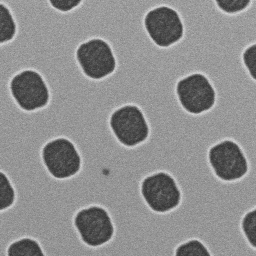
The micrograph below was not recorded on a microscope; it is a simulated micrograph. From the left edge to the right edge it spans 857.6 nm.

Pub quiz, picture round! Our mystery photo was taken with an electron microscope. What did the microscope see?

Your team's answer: a regular array of holes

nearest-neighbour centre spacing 247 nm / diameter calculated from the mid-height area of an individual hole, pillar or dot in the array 128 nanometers